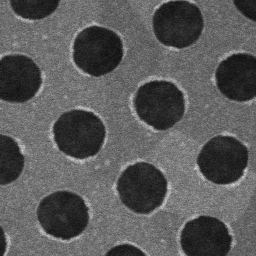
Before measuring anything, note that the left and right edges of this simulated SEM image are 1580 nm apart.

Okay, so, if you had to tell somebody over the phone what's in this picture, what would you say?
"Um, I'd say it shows holes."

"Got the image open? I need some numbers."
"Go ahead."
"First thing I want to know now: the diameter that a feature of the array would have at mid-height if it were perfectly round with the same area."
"312 nm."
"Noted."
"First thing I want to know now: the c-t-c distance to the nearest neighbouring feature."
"0.509 micrometres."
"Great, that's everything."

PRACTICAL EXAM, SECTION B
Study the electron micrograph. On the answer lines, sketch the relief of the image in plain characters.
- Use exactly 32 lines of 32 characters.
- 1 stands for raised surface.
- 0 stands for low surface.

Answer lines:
10000001111111111111000011111000
11000001111111111110000001111100
11110111111111111110000001111110
11111111111001111110000001111111
11111111110000011110000001111111
11111111100000011111000011111111
11111111100000011111111111111111
00001111100000011111111111110000
00000111110000111111111111100000
00000111111101111111111111100000
00000111111111111100001111100000
00000111111111111000000111100000
00001111111111111000000111111001
11111111111111111000000111111111
11111110000011111000000111111111
11111110000001111100001111111111
11111110000001111111111111111111
00111110000001111111111111000011
00111110000001111111111110000001
00011111100011111111111110000001
00011111111111111001111110000001
00011111111111100000111110000011
00111111111111100000011111000011
11111111111111100000011111111111
11111100001111100000011111111111
11111000000111100000111111111111
11111000000111111001111111111111
11111000000111111111111100011111
11111000000111111111111000001111
01111110001111111111111000000111
01111111111111101111111000000111
01111111111110000011111000000111